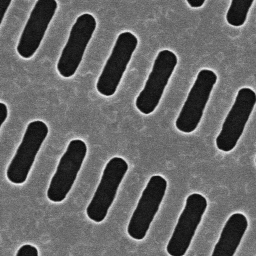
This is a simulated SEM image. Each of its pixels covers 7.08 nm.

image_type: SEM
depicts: a regular array of holes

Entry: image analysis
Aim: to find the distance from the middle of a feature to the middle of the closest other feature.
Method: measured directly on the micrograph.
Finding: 312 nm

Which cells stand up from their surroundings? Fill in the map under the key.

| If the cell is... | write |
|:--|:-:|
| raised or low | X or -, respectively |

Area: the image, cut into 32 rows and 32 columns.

-XXX---XXXXXXXXXXXXXXXXX-XXXX--X
-XXX---XXXXXXXXXXXXXXXXXXXXX---X
XXX---XXXX--XXXXXXXXXXXXXXXX---X
XXX---XXX---XXXXXXXXXXXXXXXXXXXX
XXX--XXXX---XXX--XXXXXXXXXXXXXXX
XX---XXX---XXX---XXXXXXXXXXXXXXX
XX--XXXX---XXX---XXX-XXXXXXXXXXX
XXXXXXX---XXX---XXX---XXXXXXXXXX
XXXXXXX---XXX---XXX---XXXXXXXXXX
XXXXXXXX-XXXX--XXXX--XXXX--XXXXX
XXXXXXXXXXXX---XXX---XXX---XXXXX
XXXXXXXXXXXX--XXXX--XXXX--XXXX--
XXXXXXXXXXXXXXXXX---XXX---XXX---
-XXXXXXXXXXXXXXXX--XXXX---XXX---
-XXXXXXXXXXXXXXXXXXXXX---XXX---X
XXXX--XXXXXXXXXXXXXXXX---XXX---X
XXX---XXXXXXXXXXXXXXXXX-XXX---XX
XXX---XXX-XXXXXXXXXXXXXXXXX---XX
XX---XXX---XXXXXXXXXXXXXXXX--XXX
XX--XXXX---XXXXXXXXXXXXXXXXXXXXX
X---XXX---XXX---XXXXXXXXXXXXXXXX
X---XXX---XXX---XXXXXXXXXXXXXXXX
X--XXX---XXXX--XXXX--XXXXXXXXXXX
XXXXXX---XXX---XXX---XXXXXXXXXXX
XXXXXX--XXXX--XXXX--XXXX-XXXXXXX
XXXXXXXXXXX---XXX---XXX---XXXXXX
XXXXXXXXXXX--XXXX---XXX---XXXXXX
XXXXXXXXXXXX-XXX---XXX---XXX---X
XXXXXXXXXXXXXXXX---XXX---XXX---X
XXXXXXXXXXXXXXXX--XXX---XXX---XX
XXXXXXXXXXXXXXXXXXXXX---XXX---XX
XX---XXXXXXXXXXXXXXXX--XXXX--XXX